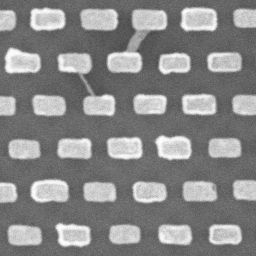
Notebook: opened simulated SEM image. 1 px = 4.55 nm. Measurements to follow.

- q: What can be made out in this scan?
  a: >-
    a regular array of raised bodies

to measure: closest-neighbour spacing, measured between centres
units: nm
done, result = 224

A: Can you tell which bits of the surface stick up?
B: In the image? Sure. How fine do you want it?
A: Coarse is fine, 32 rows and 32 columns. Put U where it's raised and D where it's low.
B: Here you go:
DDDDDDDDDDDDDDDDDDDDDDDDDDDDDDDD
UUDDUUUUDDUUUUDDDUUUDDDUUUUDDUUU
UUDDUUUUDDUUUUUDDUUUUDDUUUUDDUUU
UUDDUUUUDDDUUUDDDUUUUDDUUUUDDDDD
DDDDDDDDDDDDDDDDDUDDDDDDDDDDDDDD
DDDDDDDDDDDDDDDDUDDDDDDDDDDDDDDD
DUUDDDDDDDDDDDDUUDDDDDDDDDDDDDDD
DUUUUDDUUUUDDUUUUUDDUUUUDDUUUUDD
DUUUUDDUUUUDDDUUUUDDUUUUDDUUUUDD
DDDDDDDDDDDDDDDDDDDDDDDDDDDDDDDD
DDDDDDDDDDDDDDDDDDDDDDDDDDDDDDDD
DDDDDDDDDDDDDDDDDDDDDDDDDDDDDDDD
UUDDUUUUDDDUUUDDDUUUUDDUUUUDDUUU
UUDDUUUUDDUUUUDDDUUUUDDUUUUDDUUU
DDDDDDDDDDDDDDDDDDDDDDDDDDDDDDDD
DDDDDDDDDDDDDDDDDDDDDDDDDDDDDDDD
DDDDDDDDDDDDDDDDDDDDDDDDDDDDDDDD
DDUDDDDDUUUDDDUUUDDDUUUDDDDUUUDD
DUUUUDDUUUUDDDUUUUDDUUUUDDUUUUDD
DUUUUDDUUUUDDDUUUUDDUUUUDDUUUUDD
DDDDDDDDDDDDDDDDDDDDDDDDDDDDDDDD
DDDDDDDDDDDDDDDDDDDDDDDDDDDDDDDD
DDDDDDDDDDDDDDDDDDDDDDDDDDDDDDDD
UUDDUUUUDDDUUUDDDUUUUDDUUUUDDUUU
UUDDUUUUUDDUUUDDDUUUUDDUUUUDDUUU
DDDDDDDDDDDDDDDDDDDDDDDDDDDDDDDD
DDDDDDDDDDDDDDDDDDDDDDDDDDDDDDDD
DDDDDDDDDDDDDDDDDDDDDDDDDDDDDDDD
DUUUUDDUUUUDDDUUUDDDUUUUDDUUUUDD
DUUUUDDUUUUDDDUUUDDDUUUUDDUUUUDD
DDUUUDDDUUUDDDDDDDDDDDUDDDDDDDDD
DDDDDDDDDDDDDDDDDDDDDDDDDDDDDDDD